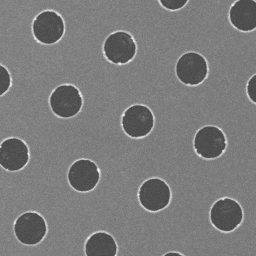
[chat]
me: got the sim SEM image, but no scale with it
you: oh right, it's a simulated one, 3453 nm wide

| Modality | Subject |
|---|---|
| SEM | a regular array of holes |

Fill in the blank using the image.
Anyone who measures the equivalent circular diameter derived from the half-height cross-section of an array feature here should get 0.426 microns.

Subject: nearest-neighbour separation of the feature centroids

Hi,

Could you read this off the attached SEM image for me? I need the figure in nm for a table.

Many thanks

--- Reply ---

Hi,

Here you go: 1000